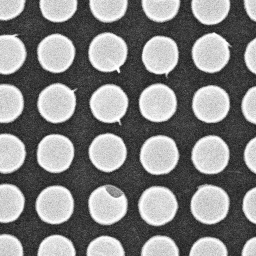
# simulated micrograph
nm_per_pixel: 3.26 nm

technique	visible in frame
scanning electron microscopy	a regular array of raised bodies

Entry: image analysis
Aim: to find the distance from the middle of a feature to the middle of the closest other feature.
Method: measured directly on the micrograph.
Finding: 163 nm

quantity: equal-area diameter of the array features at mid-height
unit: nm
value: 120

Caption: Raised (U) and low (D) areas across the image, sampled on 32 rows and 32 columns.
UUUDDUUUUUDUUUUUDDUUUUDDUUUUUDDU
UUUDDUUUUDDDUUUDDDUUUUDDUUUUDDDU
DDDDDDUUDDDDDUDDDDDDUDDDDUUUDDDD
DDDDDDDDDDDDDDDDDDDDDDDDDDDDDDDD
DUDDDDUUDDDDUUDDDDDDDDDDDDUDDDDD
UUUDDUUUUDDUUUUUDDUUUUDDUUUUDDDU
UUUDDUUUUDDUUUUUDDUUUUDDUUUUUDDU
UUUDDUUUUDDUUUUUDDUUUUDDUUUUDDDU
UUDDDDUUDDDDUUUDDDUUUUDDDUUUDDDU
DDDDDDDDDDDDDDDDDDDDDDDDDDDDDDDD
DDDDDDDDDDDDDDDDDDDDDDDDDDDDDDDD
UUDDDUUUUDDDUUUDDDUUUUDDDUUUDDDU
UUUDDUUUUDDUUUUUDUUUUUDDUUUUUDUU
UUUDDUUUUDDUUUUUDDUUUUDDUUUUUDUU
UUDDDUUUUDDDUUUDDDUUUDDDDUUUDDDU
DDDDDDDDDDDDDDDDDDDDDDDDDDDDDDDD
DDDDDDDDDDDDDDDDDDDDDDDDDDDDDDDD
UUDDDUUUUDDDUUUDDDDUUDDDDUUUDDDD
UUUDDUUUUDDUUUUUDDUUUUDDUUUUDDDU
UUUDDUUUUDDUUUUUDDUUUUDDUUUUUDDU
UUUDDUUUUDDDUUUDDDUUUUDDUUUUDDDU
DDDDDDDDDDDDDDDDDDDUUDDDDUUDDDDD
DDDDDDDDDDDDDDDDDDDDDDDDDDDDDDDD
UUDDDDUUDDDDDDDDDDDUDDDDDUUDDDDD
UUUDDUUUUDDUUUDDDDUUUUDDUUUUDDDU
UUUDDUUUUDDUUUUUDUUUUUDDUUUUDDUU
UUUDDUUUUDDUUUUUDDUUUUDDUUUUDDDU
UUDDDDUUDDDDUUUDDDUUUDDDDUUDDDDU
DDDDDDDDDDDDDDDDDDDDDDDDDDDDDDDD
UDDDDDDUDDDDDDDDDDDDDDDDDDDDDDDD
UUDDDUUUUDDUUUUDDDUUUUDDUUUUDDDU
UUUDDUUUUDDUUUUDDDUUUUDDUUUUDDUU